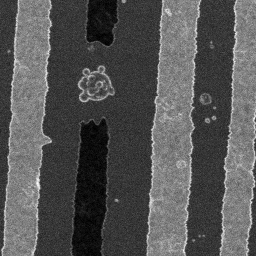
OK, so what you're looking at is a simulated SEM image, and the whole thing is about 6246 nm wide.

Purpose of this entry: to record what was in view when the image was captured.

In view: one or a few lines or trenches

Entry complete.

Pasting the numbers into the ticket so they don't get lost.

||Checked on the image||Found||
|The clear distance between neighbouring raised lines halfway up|37.4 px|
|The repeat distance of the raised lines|72.1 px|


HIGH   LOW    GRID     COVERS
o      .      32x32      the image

..oooo.....oooo.....ooooo....ooo
..oooo.....oooo.....ooooo....ooo
..oooo.....oooo.....ooooo....ooo
..oooo.....ooo......ooooo....ooo
..oooo.....ooo......oooo.....ooo
..oooo.......o......oooo.....ooo
..oooo..............oooo.....ooo
..oooo..............oooo.....ooo
..oooo......o.......oooo.....ooo
..oooo....ooo.......oooo.....ooo
..oooo....oooo......oooo.....ooo
..oooo....oooo......oooo.....ooo
.ooooo....o........ooooo.o...ooo
.ooooo..............oooo.....ooo
..ooo..............ooooo.....ooo
.oooo.....ooo......ooooo.....ooo
.oooo.....oooo.....ooooo.....ooo
.ooooo....oooo.....ooooo.....ooo
.oooo.....oooo.....ooooo.....ooo
.oooo.....ooo......ooooo....oooo
.oooo.....ooo......ooooo....oooo
.oooo.....ooo......ooooo....ooo.
.oooo.....ooo......ooooo....oooo
.oooo....oooo......ooooo....oooo
.oooo....oooo......ooooo....oooo
.ooo.....oooo......oooo.....ooo.
.oooo....oooo......oooo.....ooo.
.oooo....oooo......oooo.....ooo.
.oooo....oooo......oooo.....ooo.
.oooo....oooo......oooo.....ooo.
.ooo.....oooo.....ooooo.....ooo.
oooo.....oooo.....ooooo.....ooo.